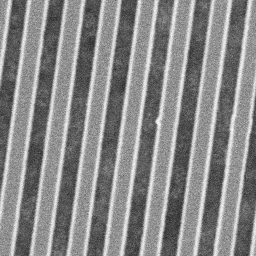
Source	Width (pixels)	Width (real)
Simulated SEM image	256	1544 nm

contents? parallel lines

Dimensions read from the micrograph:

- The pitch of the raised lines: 219 nm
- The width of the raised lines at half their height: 110 nm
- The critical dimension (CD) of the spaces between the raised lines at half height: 111 nm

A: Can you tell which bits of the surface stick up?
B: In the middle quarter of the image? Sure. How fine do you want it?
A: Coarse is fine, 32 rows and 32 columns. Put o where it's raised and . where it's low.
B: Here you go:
ooo.....oooo.....oooo.....oooo..
ooo....ooooo....ooooo.....oooo..
oo.....ooooo....ooooo....ooooo..
oo.....oooo.....ooooo....ooooo..
oo.....oooo.....oooo.....ooooo..
oo.....oooo.....oooo.....oooo...
oo.....oooo.....oooo.....oooo...
oo.....oooo.....oooo.....oooo...
oo....ooooo....ooooo.....oooo...
o.....ooooo....ooooo....ooooo...
o.....oooo.....ooooo....ooooo...
o.....oooo.....ooooo....ooooo...
o.....oooo.....oooo.....ooooo...
o.....oooo.....oooo.....oooo....
o.....oooo.....oooo....ooooo....
o....ooooo.....oooo.....oooo....
o....ooooo....ooooo....ooooo....
.....oooo.....ooooo....ooooo....
.....oooo.....ooooo....ooooo....
.....oooo.....oooo.....ooooo....
.....oooo.....oooo.....oooo.....
.....oooo.....oooo.....oooo.....
.....oooo.....oooo.....oooo.....
....ooooo....ooooo....ooooo.....
....oooo.....ooooo....ooooo.....
....oooo.....ooooo....ooooo.....
....oooo.....oooo.....ooooo....o
....oooo.....oooo.....oooo.....o
....oooo.....oooo.....oooo.....o
....oooo.....oooo.....oooo.....o
...ooooo....ooooo.....oooo.....o
...ooooo....ooooo....ooooo.....o